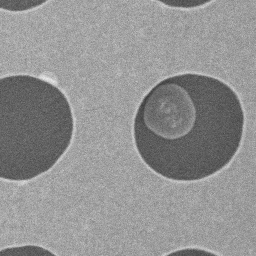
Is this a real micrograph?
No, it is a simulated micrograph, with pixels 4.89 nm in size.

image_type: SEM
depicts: holes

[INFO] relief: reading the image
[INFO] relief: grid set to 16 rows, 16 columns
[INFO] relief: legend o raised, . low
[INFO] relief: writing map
..oooooooooooooo
oooooooooooooooo
oooooooooooooooo
oooooooooooooooo
oooooooooooooooo
....oooooo....oo
....ooooo......o
.....ooo.......o
....oooo.......o
....ooooo......o
...oooooo.....oo
oooooooooooooooo
oooooooooooooooo
oooooooooooooooo
oooooooooooooooo
o..ooooooooooooo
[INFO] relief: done